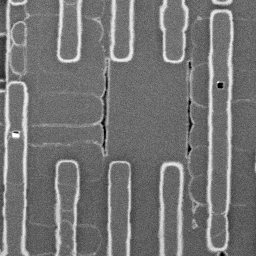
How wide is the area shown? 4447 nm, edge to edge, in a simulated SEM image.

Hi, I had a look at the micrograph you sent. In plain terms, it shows wiring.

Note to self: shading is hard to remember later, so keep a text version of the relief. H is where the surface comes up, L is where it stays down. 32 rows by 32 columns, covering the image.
LLLLLLLLHHLLLLHHHLLLLHHLLLLLLLLL
LLLLLLLLHHLLLLHHLLLLHHHLLLLHLLLL
LLLLLLLLHHLLLLHHLLLLHHHLLLHHHLLL
LLLLLLLLHHLLLLHHLLLLHHHLLLHHHLLL
LLLLLLLHHHLLLLHHLLLLLHHLLLHHHLLL
LLLLLLLHHHLLLLHHLLLLLHHLLLHHHLLL
LLLLLLLHHHLLLLHHLLLLLHHLLLHHHLLL
LLLLLLLLHLLLLLLLLLLLLHHLLLHHHLLL
LLLLLLLLLLLLLLLLLLLLLLLLLLHHHLLL
LLLLLLLLLLLLLLLLLLLLLLLLLLHHHLLL
LHHLLLLLLLLLLLLLLLLLLLLLLLHHHLLL
LHHLLLLLLLLLLLLLLLLLLLLLLLHHHLLL
LHHLLLLLLLLLLLLLLLLLLLLLLLHHHLLL
LHHLLLLLLLLLLLLLLLLLLLLLLLHHHLLL
LHHLLLLLLLLLLLLLLLLLLLLLLLHHHLLL
LHHLLLLLLLLLLLLLLLLLLLLLLLHHHLLL
LHHLLLLLLLLLLLLLLLLLLLLLLLHHHLLL
LHHLLLLLLLLLLLLLLLLLLLLLLLHHHLLL
LHHLLLLLLLLLLLLLLLLLLLLLLLHHHLLL
LHHLLLLLLLLLLLLLLLLLLLLLLLHHHLLL
LHHLLLLHHLLLLLHHLLLLLLLLLLHHHLLL
LHHLLLLHHHLLLLHHLLLLHHHLLLHHHLLL
LHHLLLLHHHLLLLHHLLLLHHHLLLHHLLLL
LHHLLLLHHHLLLLHHLLLLHHHLLLHHLLLL
LHHLLLLHHHLLLLHHLLLLHHHLLLHHLLLL
LHHLLLLHHLLLLLHHLLLLHHHLLLHHLLLL
LHHLLLLHHLLLLLHHLLLLHHLLLLHHLLLL
LHHLLLLHHLLLLLHHLLLLHHLLLLHHLLLL
LHHLLLLHHLLLLLHHLLLLHHLLLLHHLLLL
LHHLLLLHHLLLLLHHLLLLHHLLLLHHLLLL
LHHLLLLHHLLLLLHHLLLLHHLLLLHHLLLL
LHHLLLLHHLLLLLHHLLLLHHLLLLLLLLLL